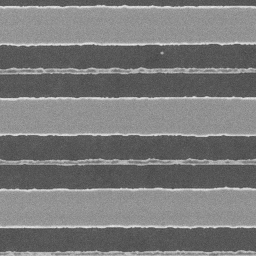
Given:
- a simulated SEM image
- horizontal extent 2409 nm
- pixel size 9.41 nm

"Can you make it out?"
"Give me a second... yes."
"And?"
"lines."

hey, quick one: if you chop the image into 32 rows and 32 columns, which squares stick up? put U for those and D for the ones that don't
DDDDDDDDDDDDDDDDDDDDDDDDDDDDDDDD
UUUUUUUUUUUUUUUUUUUUUUUUUUUUUUUU
UUUUUUUUUUUUUUUUUUUUUUUUUUUUUUUU
UUUUUUUUUUUUUUUUUUUUUUUUUUUUUUUU
UUUUUUUUUUUUUUUUUUUUUUUUUUUUUUUU
UUUUUUUUUUUUUUUUUUUUUUUUUUUUUUUU
DDDDDDDDDDDDDDDDDDDDDDDDDDDDDDDD
DDDDDDDDDDDDDDDDDDDDDDDDDDDDDDDD
DDDDDDDDDDDDDDDDDDDDDDDDDDDDDDDD
DDDDDDDDDDDDDDDDDDDDDDDDDDDDDDDD
DDDDDDDDDDDDDDDDDDDDDDDDDDDDDDDD
DDDDDDDDDDDDDDDDDDDDDDDDDDDDDDDD
UUUUUUUUUUUUUUUUUUUUUUUUUUUUUUUU
UUUUUUUUUUUUUUUUUUUUUUUUUUUUUUUU
UUUUUUUUUUUUUUUUUUUUUUUUUUUUUUUU
UUUUUUUUUUUUUUUUUUUUUUUUUUUUUUUU
UUUUUUUUUUUUUUUUUUUUUUUUUUUUUUUU
DDDDDDDDDDDDDDDDDDDDDDDDDDDDDDDD
DDDDDDDDDDDDDDDDDDDDDDDDDDDDDDDD
DDDDDDDDDDDDDDDDDDDDDDDDDDDDDDDD
DDDDDDDUUDUDDDDDDUUDDDDDUDDDDDDD
DDDDDDDDDDDDDDDDDDDDDDDDDDDDDDDD
DDDDDDDDDDDDDDDDDDDDDDDDDDDDDDDD
DDDDDDDDDDDDDDDDDDDDDDDDDDDDUDDD
UUUUUUUUUUUUUUUUUUUUUUUUUUUUUUUU
UUUUUUUUUUUUUUUUUUUUUUUUUUUUUUUU
UUUUUUUUUUUUUUUUUUUUUUUUUUUUUUUU
UUUUUUUUUUUUUUUUUUUUUUUUUUUUUUUU
DDDDDDDDDDDDDDDDDDDDDDDUDDDDDDDD
DDDDDDDDDDDDDDDDDDDDDDDDDDDDDDDD
DDDDDDDDDDDDDDDDDDDDDDDDDDDDDDDD
UUDUDDDUUUUUUUUUUUUUUUUUUUUUUUUU